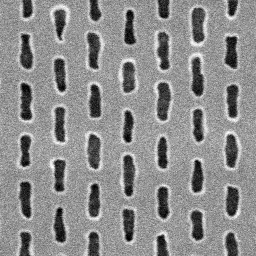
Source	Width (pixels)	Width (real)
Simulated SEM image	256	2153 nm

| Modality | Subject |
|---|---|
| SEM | a regular array of holes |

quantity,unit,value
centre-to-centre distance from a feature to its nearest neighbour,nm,350